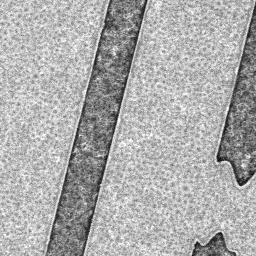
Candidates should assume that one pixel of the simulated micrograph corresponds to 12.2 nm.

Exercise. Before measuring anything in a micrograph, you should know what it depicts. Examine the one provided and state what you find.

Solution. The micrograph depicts one or a few lines or trenches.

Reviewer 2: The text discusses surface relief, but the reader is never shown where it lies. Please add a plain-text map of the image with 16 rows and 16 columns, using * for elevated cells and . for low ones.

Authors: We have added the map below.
*******..*******
******...*******
******...******.
******..*******.
******..*******.
*****...*******.
*****...******..
*****..*******..
*****..*******..
****...*******..
****...*******..
****..**********
****..**********
***...**********
***...**********
***..*******..**